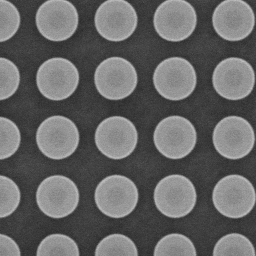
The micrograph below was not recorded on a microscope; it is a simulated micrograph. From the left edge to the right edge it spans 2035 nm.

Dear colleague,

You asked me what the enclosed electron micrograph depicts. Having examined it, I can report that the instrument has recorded an array of small figures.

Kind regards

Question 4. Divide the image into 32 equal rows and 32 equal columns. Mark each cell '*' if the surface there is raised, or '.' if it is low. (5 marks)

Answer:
*....****....***....****....***.
**...*****..*****..*****...*****
**...*****..*****..******..*****
**...****...*****..*****...*****
*....****....***....****....***.
................................
................................
*.....**.....***.....**.....**..
**...****...*****...****...****.
**...*****..*****..*****...*****
**...*****..*****..*****...*****
**...****...****....****...****.
.......*........................
................................
................................
**...****....****...****...****.
**...*****..*****..*****...*****
**...*****..*****..*****...*****
**...****...*****...****...****.
*.....**.....***.....**.....**..
................................
................................
*.....***....***....****....***.
**...*****..*****..*****...*****
**...*****..*****..*****...*****
**...*****..*****..*****...*****
**...****....***....****....***.
................................
................................
*.....**......**.....**.....**..
**...****...*****...****...****.
**...*****..*****..*****...*****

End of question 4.